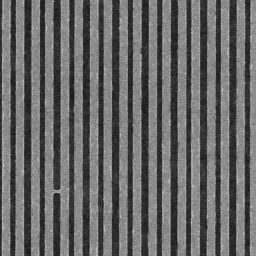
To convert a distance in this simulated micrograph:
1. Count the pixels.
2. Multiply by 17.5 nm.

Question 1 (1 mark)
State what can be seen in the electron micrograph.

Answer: parallel lines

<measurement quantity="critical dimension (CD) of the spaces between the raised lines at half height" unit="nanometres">101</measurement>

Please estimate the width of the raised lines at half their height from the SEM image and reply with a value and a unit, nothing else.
142 nm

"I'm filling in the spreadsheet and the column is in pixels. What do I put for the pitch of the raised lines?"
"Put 14.7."